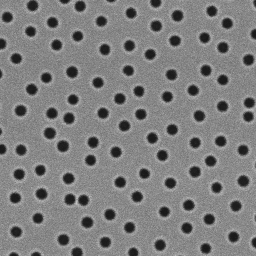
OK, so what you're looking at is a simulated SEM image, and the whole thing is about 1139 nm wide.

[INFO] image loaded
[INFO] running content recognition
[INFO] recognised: a regular array of holes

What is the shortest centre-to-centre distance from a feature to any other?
102 nm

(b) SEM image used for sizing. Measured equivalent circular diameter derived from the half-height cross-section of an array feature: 50.2 nm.